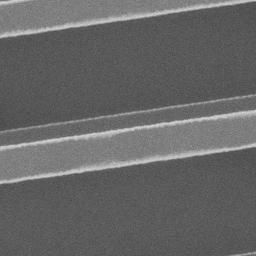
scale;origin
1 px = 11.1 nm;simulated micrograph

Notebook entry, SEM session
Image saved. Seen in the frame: lines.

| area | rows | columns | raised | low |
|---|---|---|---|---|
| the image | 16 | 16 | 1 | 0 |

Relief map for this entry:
1111111111111000
1111110000000000
0000000000000000
0000000000000000
0000000000000000
0000000000000000
0000000000001111
0000011111111111
1111111111111111
1111111111111100
1111111000000000
0000000000000000
0000000000000000
0000000000000000
0000000000000000
0000000000000000